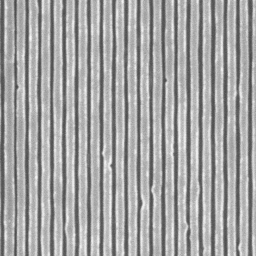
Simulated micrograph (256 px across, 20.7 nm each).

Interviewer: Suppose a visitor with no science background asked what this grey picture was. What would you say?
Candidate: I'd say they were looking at parallel lines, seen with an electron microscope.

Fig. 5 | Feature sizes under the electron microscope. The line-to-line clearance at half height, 106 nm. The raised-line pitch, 255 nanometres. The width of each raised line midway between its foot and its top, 160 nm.